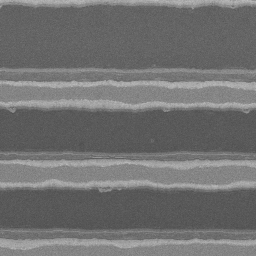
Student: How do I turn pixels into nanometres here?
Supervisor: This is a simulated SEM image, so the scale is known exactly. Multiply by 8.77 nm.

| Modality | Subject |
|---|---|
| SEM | lines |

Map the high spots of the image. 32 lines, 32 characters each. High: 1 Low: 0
00001011010000000000011110001100
00000000000000000000000000000000
00000000000000000000000000000000
00000000000000000000000000000000
00000000000000000000000000000000
00000000000000000000000000000000
00000000000000000000000000000000
00000000000000000000000000000000
00000000000000000000000000000000
11111111111111111111111111111111
11111111111111111111111111111111
11111111111111111111111111111111
11111111111111111111111111111111
01000100000111111110110000011111
00000000000000000000000000000000
00000000000000000000000000000000
00000000000000000000000000000000
00000000000000000000000000000000
00000000000000000000000000000000
11111111111111111111111111111111
11111111111111111111111111111111
11111111111111111111111111111111
11111111111111111111111111111111
10000000001011100000111111111100
00000000000000000000000000000000
00000000000000000000000000000000
00000000000000000000000000000000
00000000000000000000000000000000
00000000000000000000000000000000
11111111111111111111111111111111
11111111111111111111111111111111
11111111111111111111111111111111